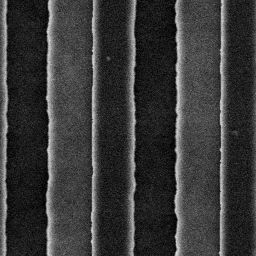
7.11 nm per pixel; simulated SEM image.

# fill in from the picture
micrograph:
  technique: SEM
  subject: lines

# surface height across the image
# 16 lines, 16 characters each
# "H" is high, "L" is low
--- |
LLLHHHHHLLLHHHHH
LLLHHHHHLLLHHHHH
LLLHHHHHLLLHHHHH
LLLHHHHHLLLHHHHH
LLLHHHHHLLLHHHHH
LLLHHHHHLLLHHHHH
LLLHHHHHLLLHHHHH
LLLHHHHHLLLHHHHH
LLLHHHHHLLLHHHHH
LLLHHHHHLLLHHHHH
LLLHHHHHLLLHHHHH
LLLHHHHHLLLHHHHH
LLLHHHHHLLLHHHHH
LLLHHHHHLLLHHHHH
LLLHHHHHLLLHHHHH
LLLHHHHHLLLHHHHH